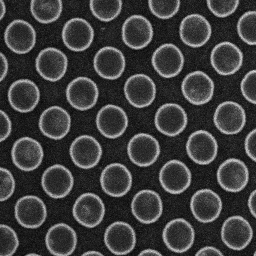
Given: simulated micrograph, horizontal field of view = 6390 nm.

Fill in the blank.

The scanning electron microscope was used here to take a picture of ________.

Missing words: a regular array of raised bodies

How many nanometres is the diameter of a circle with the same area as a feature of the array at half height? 764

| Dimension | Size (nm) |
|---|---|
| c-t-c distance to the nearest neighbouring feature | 1010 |